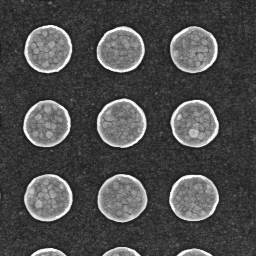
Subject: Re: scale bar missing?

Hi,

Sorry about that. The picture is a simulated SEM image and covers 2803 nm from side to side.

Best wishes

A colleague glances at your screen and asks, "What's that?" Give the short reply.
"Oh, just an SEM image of a regular array of raised bodies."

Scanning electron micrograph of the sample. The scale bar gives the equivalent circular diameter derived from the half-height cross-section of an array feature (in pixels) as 46.6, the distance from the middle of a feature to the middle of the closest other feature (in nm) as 798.